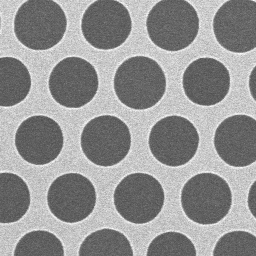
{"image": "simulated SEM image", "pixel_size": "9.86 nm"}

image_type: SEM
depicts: a regular array of holes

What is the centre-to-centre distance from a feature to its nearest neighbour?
653 nanometers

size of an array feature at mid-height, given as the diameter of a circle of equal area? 500 nanometers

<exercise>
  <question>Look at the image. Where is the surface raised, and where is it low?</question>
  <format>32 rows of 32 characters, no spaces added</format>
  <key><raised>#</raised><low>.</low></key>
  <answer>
###....####....####.....####....
##......###.....###......##.....
##......##......##.......##.....
##......##......##.......##.....
##......##......###......##.....
###....####....####.....###.....
#############################..#
..######...#####...#####...#####
...####.....###.....###.....####
....##......##.......##......##.
....##......##.......##......##.
....##......##.......##......##.
...####....####.....####....####
#########.######...#############
####..#######.#######.#######..#
###....####.....###.....###.....
##......##......###......##.....
##......##......###......##.....
##......##......###......##.....
###....####.....###.....###.....
####..######...#####...#####...#
################################
...####....####.....####....####
...###......##......###......##.
....##......##.......##......##.
....##......##......###......##.
...###.....####.....###......##.
..######..######...#####....####
################################
###....####.....####...#####....
##......##......###.....###.....
##......##.......#......###.....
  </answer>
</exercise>